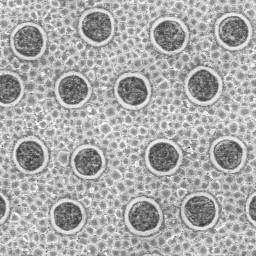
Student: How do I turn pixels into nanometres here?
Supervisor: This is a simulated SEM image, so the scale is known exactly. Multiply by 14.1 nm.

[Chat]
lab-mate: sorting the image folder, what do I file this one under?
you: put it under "a regular array of raised bodies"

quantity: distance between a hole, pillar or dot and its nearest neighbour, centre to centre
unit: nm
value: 848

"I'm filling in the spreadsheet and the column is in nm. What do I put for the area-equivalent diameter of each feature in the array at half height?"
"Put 480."